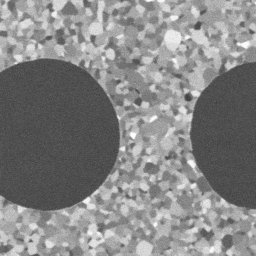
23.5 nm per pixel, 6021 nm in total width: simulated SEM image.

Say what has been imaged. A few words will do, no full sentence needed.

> holes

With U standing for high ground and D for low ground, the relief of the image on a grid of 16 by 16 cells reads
UUUUUUUUUUUUUUUU
UUUUUUUUUUUUUUUU
UUUUUUUUUUUUUUUU
UUUUUUUUUUUUUUUU
DDDDDUUUUUUUUUDD
DDDDDDUUUUUUUDDD
DDDDDDDUUUUUDDDD
DDDDDDDUUUUUDDDD
DDDDDDDDUUUUDDDD
DDDDDDDUUUUUDDDD
DDDDDDDUUUUUDDDD
DDDDDDUUUUUUUDDD
DDDDDUUUUUUUUUDD
UUUUUUUUUUUUUUUU
UUUUUUUUUUUUUUUU
UUUUUUUUUUUUUUUU